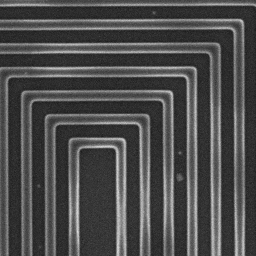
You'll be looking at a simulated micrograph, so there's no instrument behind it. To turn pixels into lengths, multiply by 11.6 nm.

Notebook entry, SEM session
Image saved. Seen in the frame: groups of lines, slits or small figures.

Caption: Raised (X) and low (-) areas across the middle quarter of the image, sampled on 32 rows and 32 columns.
--------------------------------
XXXXXXXXXXXXXXXXXXXXXXXXXXXXXXXX
XXXXXXXXXXXXXXXXXXXXXXXXXXXXXXXX
-------------------------------X
-------------------------------X
-------------------------------X
-------------------------------X
XXXXXXXXXXXXXXXXXXXXXXXXXXX----X
XXXXXXXXXXXXXXXXXXXXXXXXXXX----X
-------------------------XX----X
-------------------------XX----X
-------------------------XX----X
-------------------------XX----X
XXXXXXXXXXXXXXXXXXXXX----XX----X
XXXXXXXXXXXXXXXXXXXXX----XX----X
-------------------XX----XX----X
-------------------XX----XX----X
-------------------XX----XX----X
-------------------XX----XX----X
-XXXXXXXXXXXXXX----XX----XX----X
-XXXXXXXXXXXXXX----XX----XX----X
-XXX---------XX----XX----XX----X
-XXX---------XX----XX----XX----X
-XXX---------XX----XX----XX----X
-XXX---------XX----XX----XX----X
-XXX---------XX----XX----XX----X
-XXX---------XX----XX----XX----X
-XXX---------XX----XX----XX----X
-XXX---------XX----XX----XX----X
-XXX---------XX----XX----XX----X
-XXX---------XX----XX----XX----X
-XXX---------XX----XX----XX----X